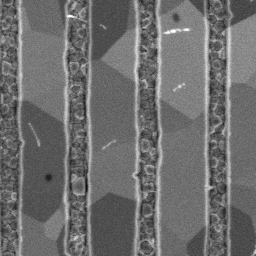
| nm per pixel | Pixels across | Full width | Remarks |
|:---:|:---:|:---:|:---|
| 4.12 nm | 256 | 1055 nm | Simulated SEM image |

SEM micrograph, one or a few lines or trenches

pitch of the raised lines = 286 nanometers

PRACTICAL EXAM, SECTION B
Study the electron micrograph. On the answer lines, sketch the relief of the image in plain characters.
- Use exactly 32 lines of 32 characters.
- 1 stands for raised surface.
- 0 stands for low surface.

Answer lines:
00011111000111111000111111000111
00011111000111111000111111000111
00011111100111111000111111000111
00011111000111111000111111000111
00011111000111111000111111000111
00011111000111111000111111000111
00011111000111111000111111000111
00011111000111111000111111000111
00011111000111111000111111000111
00011111000111111000111111000111
00011111000111111000111111000111
00011111000111111000111111000111
00011111000111111000111111000111
00111111000111111000111111000111
00111111000111111000111111000111
00111111000111111000111111000111
00011111000111111000111111000111
00011111000111111000111111000111
00011111000111111000111111000111
00011111000111111000111111000111
00011111000111111000111111000111
00011111000111111000111111000111
00011111000111111000111111000111
00011111000111111000111111000111
00011111000111111000111111000111
00011111000111111000111111000111
00011111000111111000111111000111
00011111000111111000111111000111
00011111000111111000111111000111
00011111000111111000111111000111
00011111000111111000111111000111
00111111000111111000111111000111